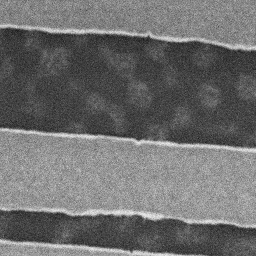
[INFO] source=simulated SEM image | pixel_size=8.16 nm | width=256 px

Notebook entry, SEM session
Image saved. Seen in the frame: one or a few lines or trenches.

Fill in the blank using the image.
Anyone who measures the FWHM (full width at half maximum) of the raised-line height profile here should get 613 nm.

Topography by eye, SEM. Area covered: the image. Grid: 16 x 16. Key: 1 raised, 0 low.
1111111111111111
1111111111111111
0000000000000111
0000000000000000
0000000000000000
0000000000000000
0000000000000000
0000000000000000
1111000000000000
1111111111111111
1111111111111111
1111111111111111
1111111111111111
0000000001111111
0000000000000000
1111100000000000